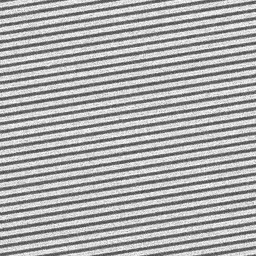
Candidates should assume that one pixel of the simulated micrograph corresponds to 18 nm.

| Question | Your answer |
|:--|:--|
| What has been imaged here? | parallel lines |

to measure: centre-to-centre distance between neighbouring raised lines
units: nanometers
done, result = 146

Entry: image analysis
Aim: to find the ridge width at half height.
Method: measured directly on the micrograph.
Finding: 87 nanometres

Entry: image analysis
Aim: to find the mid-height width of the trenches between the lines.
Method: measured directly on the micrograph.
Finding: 69.1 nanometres